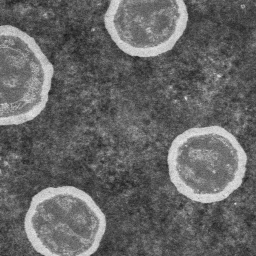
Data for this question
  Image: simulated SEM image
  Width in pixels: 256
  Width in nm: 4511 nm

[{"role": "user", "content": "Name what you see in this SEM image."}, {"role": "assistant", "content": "raised bodies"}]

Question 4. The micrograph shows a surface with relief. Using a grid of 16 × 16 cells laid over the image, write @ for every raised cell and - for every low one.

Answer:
-------@@@@-----
-------@@@@-----
@@-----@@@@-----
@@@-------------
@@@-------------
@@@-------------
@@@-------------
@---------------
------------@@--
-----------@@@@-
-----------@@@@-
-----------@@@@-
--@@@-----------
--@@@@----------
--@@@@----------
---@@@----------